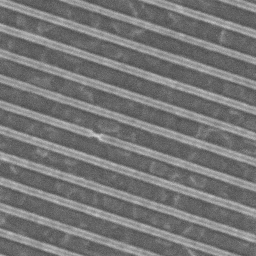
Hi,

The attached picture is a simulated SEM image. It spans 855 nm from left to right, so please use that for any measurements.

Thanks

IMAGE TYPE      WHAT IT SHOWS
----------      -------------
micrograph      parallel lines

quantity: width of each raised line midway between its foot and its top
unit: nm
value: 20.2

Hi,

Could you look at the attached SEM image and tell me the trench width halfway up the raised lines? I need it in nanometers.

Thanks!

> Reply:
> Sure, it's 60.3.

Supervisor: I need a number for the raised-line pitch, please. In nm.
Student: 81.2